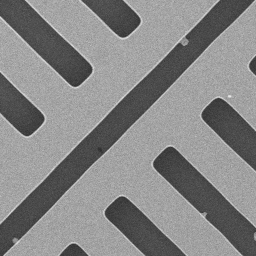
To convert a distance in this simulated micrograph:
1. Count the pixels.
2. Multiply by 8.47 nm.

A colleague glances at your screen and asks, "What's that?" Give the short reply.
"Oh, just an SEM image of groups of lines, slits or small figures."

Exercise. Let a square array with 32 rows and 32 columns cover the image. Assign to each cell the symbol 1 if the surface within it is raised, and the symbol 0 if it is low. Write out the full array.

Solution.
00001111111000001111111111100001
00000111111100000111111111000001
00000011111110000011111110000011
10000001111111000111111100001111
11000000111111101111111000011111
11100000011111111111110000111111
11110000001111111111100001111111
11111000000111111111000011111110
11111110000011111110000011111110
01111111000111111100000111111111
01111111101111111000001111111111
00011111111111110000011111111111
00001111111111100000111111101111
00000111111111000001111111000111
00000111111110000011111110000011
10000111111100000111111111000001
11001111111000001111111111100000
11111111110000011111111111110000
11111111100000111111101111111000
11111111000001111111000111111100
11111110000011111110000011111110
11111100000111111111000001111111
11111000001111111111100000111111
11110000011111111111110000011111
11100000111111111111111000001111
11000001111111000111111100000111
10000011111110000011111110000011
10000111111111000001111111000001
00001111111111100000111111100000
00011111111111110000011111110000
00111111101111111000001111111000
01111111000111111100000111111100